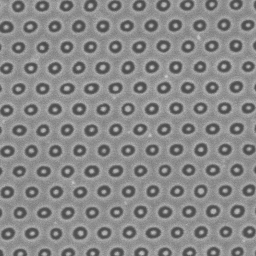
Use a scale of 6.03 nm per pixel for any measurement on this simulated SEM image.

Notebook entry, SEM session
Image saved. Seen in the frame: a regular array of ring-shaped grooves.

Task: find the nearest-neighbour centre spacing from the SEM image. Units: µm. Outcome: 0.141